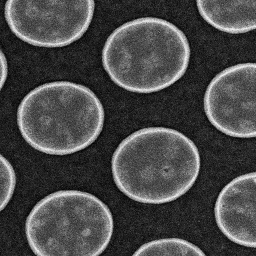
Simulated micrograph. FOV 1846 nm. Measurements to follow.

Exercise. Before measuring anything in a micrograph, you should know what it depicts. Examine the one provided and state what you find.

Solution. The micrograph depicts raised bodies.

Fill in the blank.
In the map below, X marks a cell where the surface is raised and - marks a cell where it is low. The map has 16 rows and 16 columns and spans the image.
XXXXXX-------XXX
-XXXXX--XXX--XXX
--XXX--XXXXX----
-------XXXXX----
-------XXXX---XX
---XX---XX---XXX
-XXXXX-------XXX
-XXXXX-------XXX
--XXXX--XXX-----
---X---XXXXX----
X------XXXXX----
X------XXXXX--XX
---XXX---XX---XX
--XXXXX-------XX
--XXXXX-------XX
--XXXX---XXX----